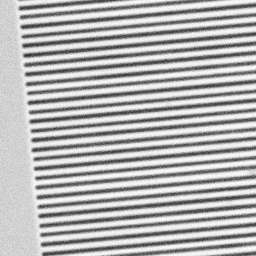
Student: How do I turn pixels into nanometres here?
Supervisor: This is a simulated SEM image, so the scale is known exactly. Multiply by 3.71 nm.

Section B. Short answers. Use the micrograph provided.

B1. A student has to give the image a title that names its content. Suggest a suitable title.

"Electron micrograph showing parallel lines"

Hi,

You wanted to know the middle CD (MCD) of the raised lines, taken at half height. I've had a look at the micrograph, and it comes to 18.4 nanometers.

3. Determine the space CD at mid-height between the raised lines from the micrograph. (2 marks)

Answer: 0.0184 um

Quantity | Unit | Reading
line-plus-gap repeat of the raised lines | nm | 35.2